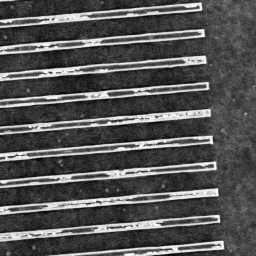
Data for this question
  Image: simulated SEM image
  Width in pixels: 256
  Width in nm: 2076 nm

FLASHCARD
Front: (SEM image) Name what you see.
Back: parallel lines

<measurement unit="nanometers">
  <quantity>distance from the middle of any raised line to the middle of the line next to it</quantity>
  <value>215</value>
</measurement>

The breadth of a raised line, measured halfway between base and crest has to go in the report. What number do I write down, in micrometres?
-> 0.0535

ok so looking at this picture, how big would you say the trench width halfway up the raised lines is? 160 nm